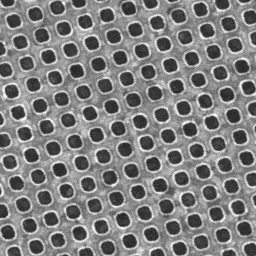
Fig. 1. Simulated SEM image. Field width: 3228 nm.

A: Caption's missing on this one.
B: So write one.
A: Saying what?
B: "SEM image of a regular array of holes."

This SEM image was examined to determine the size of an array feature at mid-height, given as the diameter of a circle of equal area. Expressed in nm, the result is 198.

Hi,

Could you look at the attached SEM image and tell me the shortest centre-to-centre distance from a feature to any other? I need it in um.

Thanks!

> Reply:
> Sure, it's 0.279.